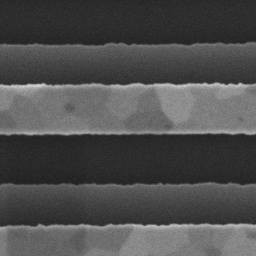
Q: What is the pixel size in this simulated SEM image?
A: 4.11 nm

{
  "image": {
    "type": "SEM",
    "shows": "lines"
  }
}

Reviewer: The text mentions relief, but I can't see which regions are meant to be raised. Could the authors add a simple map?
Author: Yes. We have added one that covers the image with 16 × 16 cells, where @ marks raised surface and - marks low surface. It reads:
----------------
----------------
----------------
@@@@@@@@@@@@@@@@
@@@@@@@@@@@@@@@@
@@@@@@@@@@@@@@@@
@@@@@@@@@@@@@@@@
@@@@@@@@@@@@@@@@
----------------
----------------
----------------
------------@@--
@@@@@@@@@@@@@@@@
@@@@@@@@@@@@@@@@
@@@@@@@@@@@@@@@@
@@@@@@@@@@@@@@@@